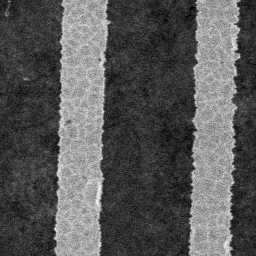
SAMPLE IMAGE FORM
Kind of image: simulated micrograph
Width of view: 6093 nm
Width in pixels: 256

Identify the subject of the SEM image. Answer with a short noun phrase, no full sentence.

one or a few lines or trenches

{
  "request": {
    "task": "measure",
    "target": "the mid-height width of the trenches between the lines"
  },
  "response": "2180 nm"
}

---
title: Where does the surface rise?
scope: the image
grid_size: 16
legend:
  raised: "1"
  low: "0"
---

0000111000001110
0000111000001110
0000111000001110
0000110000001110
0000110000001110
0000110000001110
0000110000001110
0000110000001110
0000110000001110
0000110000001110
0000110000001100
0000110000001100
0000110000001100
0000110000001100
0000110000001100
0000110000001100